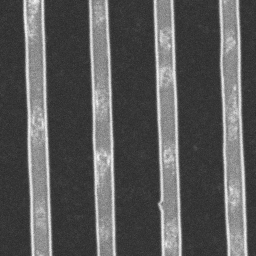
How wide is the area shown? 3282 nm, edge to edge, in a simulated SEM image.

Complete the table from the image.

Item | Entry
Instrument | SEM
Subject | one or a few lines or trenches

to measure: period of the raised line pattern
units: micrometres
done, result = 0.833